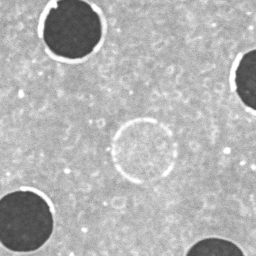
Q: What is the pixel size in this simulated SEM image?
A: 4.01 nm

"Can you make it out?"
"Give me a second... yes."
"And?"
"holes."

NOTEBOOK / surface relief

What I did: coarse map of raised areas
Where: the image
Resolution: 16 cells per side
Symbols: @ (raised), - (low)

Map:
@@@---@@@@@@@@@@
@@@---@@@@@@@@@@
@@@---@@@@@@@@@@
@@@@-@@@@@@@@@@-
@@@@@@@@@@@@@@@-
@@@@@@@@@@@@@@@-
@@@@@@@@@@@@@@@-
@@@@@@@@@@@@@@@@
@@@@@@@@@@@@@@@@
@@@@@@@@@@@@@@@@
@@@@@@@@@@@@@@@@
@@@@@@@@@@@@@@@@
---@@@@@@@@@@@@@
---@@@@@@@@@@@@@
---@@@@@@@@@@@@@
--@@@@@@@@@@---@